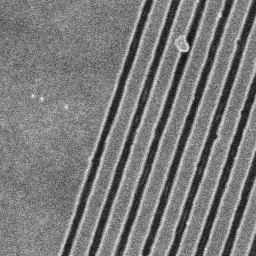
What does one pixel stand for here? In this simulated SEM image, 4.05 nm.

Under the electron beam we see parallel lines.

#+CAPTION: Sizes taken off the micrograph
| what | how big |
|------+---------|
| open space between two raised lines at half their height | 34.1 nm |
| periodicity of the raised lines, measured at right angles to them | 103 nm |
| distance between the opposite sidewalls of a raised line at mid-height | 0.0688 um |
